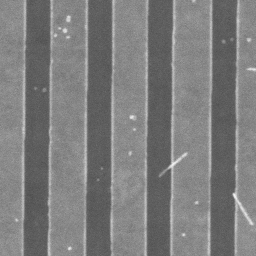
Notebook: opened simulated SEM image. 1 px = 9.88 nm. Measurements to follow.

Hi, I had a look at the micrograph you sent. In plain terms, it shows lines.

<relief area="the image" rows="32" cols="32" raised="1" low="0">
11100011111000111100001111000011
11100011111000111100001111000011
11100011111000111100001111000011
11100011111000111100001111000011
11100011111000111100001111000011
11100011111000111100001111000011
11100011111000111100001111000011
11100011111000111100001111000011
11100011111000111100011111000011
11100011111000111100001111000011
11100011111000111100001111000011
11100011111000111100001111000011
11100011111000111100001111000011
11100011111000111100001111000011
11100011111000111100011111000011
11100011111000111100011111000011
11100011111000111100011111000011
11100011111000111100011111000011
11100011111000111100011111000011
11100011111000111100011111000011
11100011111000111100011111000011
11100011111000111100011111000111
11100011111000111100011111000011
11100011111000111100011111000111
11100011111000111100011111000111
11100011111000111100011111000111
11100011111000111100011111000111
11100011111000111100011111000111
11100011111000111100011111000111
11100011111000111100011111000111
11100011111000111100011111000111
11100011111000111100011111000111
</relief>